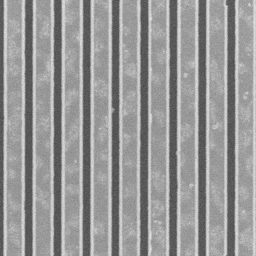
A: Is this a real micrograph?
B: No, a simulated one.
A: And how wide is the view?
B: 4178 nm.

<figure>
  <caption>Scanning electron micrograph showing parallel lines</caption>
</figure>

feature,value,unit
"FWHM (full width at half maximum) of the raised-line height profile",294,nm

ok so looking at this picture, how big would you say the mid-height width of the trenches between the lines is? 0.182 um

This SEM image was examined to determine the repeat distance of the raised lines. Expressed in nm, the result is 472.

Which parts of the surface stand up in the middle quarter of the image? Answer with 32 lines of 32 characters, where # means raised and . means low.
####...####...#####...####...###
####...####...#####...####...###
####...####...#####...####...###
####...####...#####...####...###
####...####...#####...####...###
####...####...#####...####...###
####...####...#####...####...###
####...####...#####...####...###
####...####...#####...####...###
####...####...####....####...###
####...####...#####...####...###
####...####...####....####...###
####...####...#####...####...###
####...####...#####...####...###
####...####...####....####...###
####...####...####....####...###
####...####...####....####...###
####...####...####....####...###
####...####...####....####...###
####...####...#####...####...###
####...####...#####...####...###
####...####...####....####...###
####...####...####....####...###
####...####...####....####...###
####...####...####....####...###
####...####...####....####...###
####...####...####....####...###
####...####...####....####...###
####...####...####....####...###
####...####...####....####...###
####...####...####...#####...###
####...####...####...#####...###